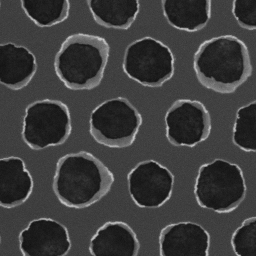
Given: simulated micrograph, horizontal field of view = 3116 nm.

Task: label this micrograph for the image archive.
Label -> a regular array of holes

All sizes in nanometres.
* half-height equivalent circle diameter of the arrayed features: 553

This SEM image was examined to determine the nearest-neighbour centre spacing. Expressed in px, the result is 67.9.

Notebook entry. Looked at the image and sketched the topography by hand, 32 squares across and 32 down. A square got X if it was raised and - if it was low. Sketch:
XXX-----XXX------XXXX-----XXX---
XXX-----XXXX-----XXXX-----XXX---
XXXX---XXXXXX---XXXXX-----XXXX--
XXXXXXXXXXXXXXXXXXXXXXX-XXXXXXXX
XXXXXXXXXXXXXXXXXXXXXXXXXXXXXXXX
XXXXXXXXX---XXXXX---XXXXXX----XX
----XXXX-----XXX-----XXXX-----XX
----XXX------XXX-----XXXX------X
----XXX------XXX-----XXXX------X
----XXXX----XXXXX----XXXX-----XX
X--XXXXXX--XXXXXXXX-XXXXXXX--XXX
XXXXXXXXXXXXXXXXXXXXXXXXXXXXXXXX
XXXXXXXXXXXXXX--XXXXXXXXXXXXXXXX
XXXX----XXXX-----XXXXX---XXXXX--
XXX-----XXXX-----XXXX-----XXXX--
XXX-----XXXX-----XXXX-----XXXX--
XXX-----XXXX-----XXXX-----XXX---
XXX-----XXXXX---XXXXX----XXXX---
XXXXXXXXXXXXXXXXXXXXXXXXXXXXXX--
XXXXXXXXXX-XXXXXXXXXXXXXXXXXXXXX
---XXXXX----XXXXXX--XXXXXX---XXX
---XXXX------XXXX----XXXX-----XX
----XXX------XXX------XXX-----XX
----XXX------XXX-----XXXX-----XX
---XXXXX----XXXXX----XXXX-----XX
X-XXXXXXX-XXXXXXXX--XXXXX-----XX
XXXXXXXXXXXXXXXXXXXXXXXXXXXXXXXX
XXXXXXXXXXXXXXXXXXXXXXXXXXXXXXXX
XXXX----XXXXX---XXXXX----XXXXX--
XXX-----XXXX-----XXXX-----XXX---
XXX------XXX-----XXX------XXX---
XXX-----XXXX-----XXX------XXXX--